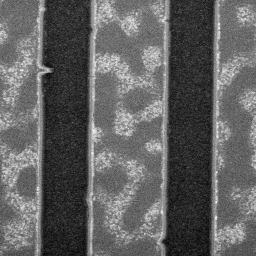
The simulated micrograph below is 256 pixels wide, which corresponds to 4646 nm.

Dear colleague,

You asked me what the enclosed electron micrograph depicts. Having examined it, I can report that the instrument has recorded one or a few lines or trenches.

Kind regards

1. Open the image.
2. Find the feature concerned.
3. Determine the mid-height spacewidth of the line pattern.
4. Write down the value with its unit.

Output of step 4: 917 nm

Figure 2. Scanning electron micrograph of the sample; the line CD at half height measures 1340 nm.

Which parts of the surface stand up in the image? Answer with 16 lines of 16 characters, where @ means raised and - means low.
@@@---@@@@----@@
@@@---@@@@----@@
@@@---@@@@----@@
@@----@@@@---@@@
@@@---@@@@----@@
@@----@@@@----@@
@@@---@@@@----@@
@@@---@@@@---@@@
@@----@@@@---@@@
@@----@@@@---@@@
@@----@@@@---@@@
@@----@@@@---@@@
@@----@@@@---@@@
@@----@@@@---@@@
@@----@@@@---@@@
@@----@@@@---@@@